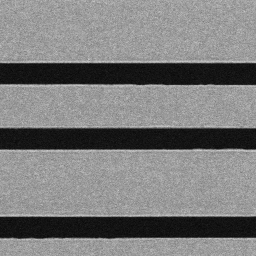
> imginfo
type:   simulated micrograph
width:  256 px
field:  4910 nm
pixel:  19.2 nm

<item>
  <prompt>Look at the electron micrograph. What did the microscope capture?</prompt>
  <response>lines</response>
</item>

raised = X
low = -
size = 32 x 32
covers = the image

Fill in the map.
XXXXXXXXXXXXXXXXXXXXXXXXXXXXXXXX
XXXXXXXXXXXXXXXXXXXXXXXXXXXXXXXX
XXXXXXXXXXXXXXXXXXXXXXXXXXXXXXXX
XXXXXXXXXXXXXXXXXXXXXXXXXXXXXXXX
XXXXXXXXXXXXXXXXXXXXXXXXXXXXXXXX
XXXXXXXXXXXXXXXXXXXXXXXXXXXXXXXX
XXXXXXXXXXXXXXXXXXXXXXXXXXXXXXXX
XXXXXXXXXXXXXXXXXXXXXXXXXXXXXXXX
--------------------------------
--------------------------------
--------------------------------
XXXXXXXXXXXXXXXXXXXXXXXXXXXXXXXX
XXXXXXXXXXXXXXXXXXXXXXXXXXXXXXXX
XXXXXXXXXXXXXXXXXXXXXXXXXXXXXXXX
XXXXXXXXXXXXXXXXXXXXXXXXXXXXXXXX
XXXXXXXXXXXXXXXXXXXXXXXXXXXXXXXX
--------------------------------
--------------------------------
--------------------------------
XXXXXXXXXXXXXXXXXXXXXXXXXXXXXXXX
XXXXXXXXXXXXXXXXXXXXXXXXXXXXXXXX
XXXXXXXXXXXXXXXXXXXXXXXXXXXXXXXX
XXXXXXXXXXXXXXXXXXXXXXXXXXXXXXXX
XXXXXXXXXXXXXXXXXXXXXXXXXXXXXXXX
XXXXXXXXXXXXXXXXXXXXXXXXXXXXXXXX
XXXXXXXXXXXXXXXXXXXXXXXXXXXXXXXX
XXXXXXXXXXXXXXXXXXXXXXXXXXXXXXXX
--------------------------------
--------------------------------
--------------------------------
XXXXXXXXXXXXXXXXXXXXXXXXXXXXXXXX
XXXXXXXXXXXXXXXXXXXXXXXXXXXXXXXX